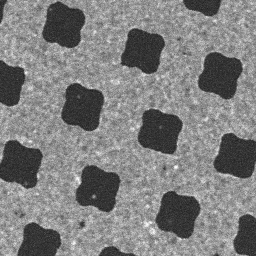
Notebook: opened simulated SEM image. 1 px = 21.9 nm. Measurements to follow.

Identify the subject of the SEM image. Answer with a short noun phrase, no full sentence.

holes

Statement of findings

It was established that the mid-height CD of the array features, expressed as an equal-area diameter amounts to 44.5 pixels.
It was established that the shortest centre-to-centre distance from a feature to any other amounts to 1780 nm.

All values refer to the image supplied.